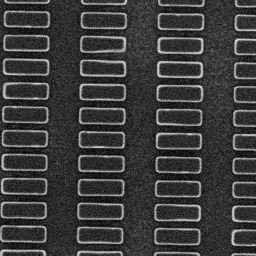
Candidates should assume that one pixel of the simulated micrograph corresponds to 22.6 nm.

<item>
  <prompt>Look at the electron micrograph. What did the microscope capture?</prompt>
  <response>groups of lines, slits or small figures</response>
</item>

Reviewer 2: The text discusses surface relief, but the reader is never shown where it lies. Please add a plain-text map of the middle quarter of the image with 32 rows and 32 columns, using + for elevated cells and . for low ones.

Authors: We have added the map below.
....+++++++++++.........++++++++
....+++++++++++.........++++++++
....+++++++++++.........++++++++
................................
................................
....+++++++++++.........+++++++.
....+++++++++++.........++++++++
....+++++++++++........+++++++++
....+++++++++++........+++++++++
................................
................................
....+++++++++++.........++++++++
....+++++++++++........+++++++++
....+++++++++++........+++++++++
....+++++++++++........+++++++++
................................
................................
....+++++++++++.................
....+++++++++++........+++++++++
....+++++++++++........+++++++++
....+++++++++++........+++++++++
................................
................................
....+++++++++++.........+++++++.
....+++++++++++........+++++++++
....+++++++++++........+++++++++
....+++++++++++........+++++++++
................................
................................
....+++++++++++........+++++++++
....+++++++++++........+++++++++
....+++++++++++........+++++++++